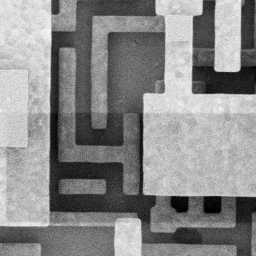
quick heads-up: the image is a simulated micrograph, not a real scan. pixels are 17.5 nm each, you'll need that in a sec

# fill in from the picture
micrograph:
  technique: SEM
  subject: wiring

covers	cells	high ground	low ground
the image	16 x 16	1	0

1110000000111110
1110000000110110
1110000000110110
1110000000110110
1110000000110000
1110000000110000
1110000001111111
1110000001111111
1110000001111111
1110000001111111
1110000001111111
1110000001111111
1110000000000000
1110000000000000
0000000110000000
0000000110000000